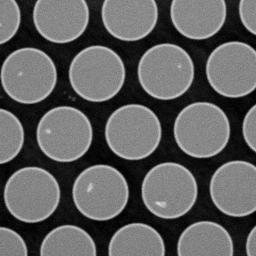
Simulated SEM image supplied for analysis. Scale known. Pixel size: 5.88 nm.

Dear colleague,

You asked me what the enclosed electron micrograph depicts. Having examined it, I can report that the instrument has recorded an array of small figures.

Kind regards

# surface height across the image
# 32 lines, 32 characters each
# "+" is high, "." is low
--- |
++...++++++..++++++..+++++++..++
++..+++++++..+++++++.+++++++..++
++..+++++++..+++++++..++++++..++
++...++++++..++++++...++++++...+
++...+++++....++++.....+++......
............................+++.
..+++.....++++....+++++....+++++
.+++++...++++++...++++++..++++++
+++++++..+++++++.+++++++..++++++
+++++++..+++++++.+++++++..++++++
+++++++..++++++...++++++..++++++
.+++++....+++++...+++++....++++.
..+++......++...................
.......++......+++.....++++.....
++...++++++...+++++...++++++...+
+++..++++++..+++++++..+++++++.++
+++..++++++..+++++++..+++++++.++
+++..++++++..+++++++..++++++...+
+++..++++++...+++++....+++++...+
++....++++.....+++......++......
....................++......+++.
..++++....+++++....+++++...+++++
.++++++...++++++..++++++..++++++
.++++++..+++++++..+++++++.++++++
.++++++..+++++++..++++++..++++++
.++++++..+++++++..++++++...+++++
.++++++...+++++....++++.....++++
...++.......+...................
+......+++.....++++....+++++....
++....+++++...++++++...++++++..+
+++..+++++++..++++++..+++++++..+
+++..+++++++..+++++++.+++++++..+